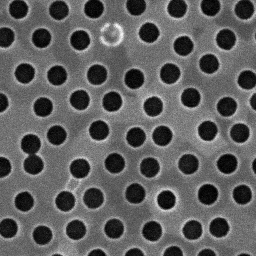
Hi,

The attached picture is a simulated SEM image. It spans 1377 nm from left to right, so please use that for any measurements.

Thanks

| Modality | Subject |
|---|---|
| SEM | a regular array of holes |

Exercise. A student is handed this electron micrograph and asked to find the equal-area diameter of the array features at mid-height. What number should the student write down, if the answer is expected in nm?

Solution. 114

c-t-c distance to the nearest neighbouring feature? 168 nm